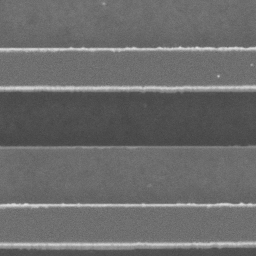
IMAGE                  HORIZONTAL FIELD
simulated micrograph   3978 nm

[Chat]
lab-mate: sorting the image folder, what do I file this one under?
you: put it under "lines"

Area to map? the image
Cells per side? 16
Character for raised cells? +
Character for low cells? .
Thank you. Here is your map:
++++++++++++++++
++++++++++++++++
++++++++++++++++
++++++++++++++++
++++++++++++++++
++++++++++++++++
................
................
................
++++++++++++++++
++++++++++++++++
++++++++++++++++
++++++++++++++++
++++++++++++++++
++++++++++++++++
................